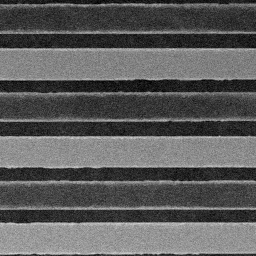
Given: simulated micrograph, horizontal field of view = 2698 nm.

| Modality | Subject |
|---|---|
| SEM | lines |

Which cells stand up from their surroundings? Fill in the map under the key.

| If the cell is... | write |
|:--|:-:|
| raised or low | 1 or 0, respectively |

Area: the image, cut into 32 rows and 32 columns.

00000000000000000000000000000000
11111111111111111111111111111111
11111111111111111111111111111111
11111111111111111111111111111111
00000000000000000000000000000000
00000000000000000000000000000000
11111111111111111111111111111111
11111111111111111111111111111111
11111111111111111111111111111111
11111111111111111111111111111111
00000000000000000000000000000000
00000000000000000000000000000000
11111111111111111111111111111111
11111111111111111111111111111111
11111111111111111111111111111111
00000000000000000000000000000000
00000000000000000000000000000000
11111111111111111111111111111111
11111111111111111111111111111111
11111111111111111111111111111111
11111111111111111111111111111111
00000000000000000000000000000000
00000000000000000000000000000000
11111111111111111111111111111111
11111111111111111111111111111111
11111111111111111111111111111111
00000000000000000000000000000000
00000000000000000000000000000000
11111111111111111111111111111111
11111111111111111111111111111111
11111111111111111111111111111111
11111111111111111111111111111111